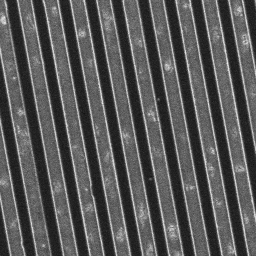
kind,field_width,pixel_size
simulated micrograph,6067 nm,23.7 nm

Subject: parallel lines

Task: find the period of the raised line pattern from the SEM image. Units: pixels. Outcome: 26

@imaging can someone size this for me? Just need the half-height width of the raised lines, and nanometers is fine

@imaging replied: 303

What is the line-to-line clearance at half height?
327 nm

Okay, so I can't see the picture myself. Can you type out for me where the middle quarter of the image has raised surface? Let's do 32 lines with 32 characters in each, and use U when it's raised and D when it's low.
DUUUUDDDUUUDDDDUUUDDDUUUDDDDUUUD
DDUUUDDDUUUDDDDUUUDDDUUUDDDDUUUD
DDUUUDDDUUUUDDDUUUDDDDUUUDDDUUUD
DDUUUDDDUUUUDDDUUUDDDDUUUDDDUUUU
DDUUUDDDDUUUDDDUUUUDDDUUUDDDDUUU
DDUUUDDDDUUUDDDDUUUDDDUUUDDDDUUU
DDUUUUDDDUUUDDDDUUUDDDUUUDDDDUUU
DDDUUUDDDUUUUDDDUUUDDDUUUUDDDUUU
DDDUUUDDDUUUUDDDUUUDDDDUUUDDDUUU
DDDUUUDDDDUUUDDDUUUDDDDUUUDDDDUU
DDDUUUDDDDUUUDDDUUUUDDDUUUDDDDUU
DDDUUUUDDDUUUDDDDUUUDDDUUUDDDDUU
DDDDUUUDDDUUUDDDDUUUDDDUUUDDDDUU
DDDDUUUDDDUUUUDDDUUUDDDDUUUDDDUU
UDDDUUUDDDUUUUDDDUUUDDDDUUUDDDUU
UDDDUUUDDDDUUUDDDUUUUDDDUUUDDDDU
UDDDUUUDDDDUUUDDDDUUUDDDUUUDDDDU
UDDDUUUUDDDUUUDDDDUUUDDDUUUDDDDU
UDDDDUUUDDDUUUUDDDUUUDDDUUUUDDDU
UDDDDUUUDDDUUUDDDDUUUDDDDUUUDDDU
UUDDDUUUDDDDUUUDDDUUUDDDDUUUDDDD
UUDDDUUUDDDDUUUDDDUUUUDDDUUUDDDD
UUDDDUUUUDDDUUUDDDDUUUDDDUUUDDDD
UUDDDDUUUDDDUUUDDDDUUUDDDUUUDDDD
UUDDDDUUUDDDUUUDDDDUUUDDDDUUUDDD
UUUDDDUUUDDDDUUUDDDUUUDDDDUUUDDD
UUUDDDUUUDDDDUUUDDDUUUUDDDUUUDDD
UUUDDDUUUDDDDUUUDDDDUUUDDDUUUDDD
UUUDDDUUUUDDDUUUDDDDUUUDDDUUUDDD
UUUDDDDUUUDDDUUUDDDDUUUDDDUUUUDD
UUUDDDDUUUDDDUUUDDDDUUUDDDDUUUDD
DUUUDDDUUUDDDDUUUDDDUUUDDDDUUUDD